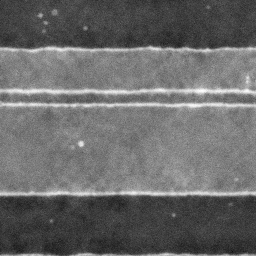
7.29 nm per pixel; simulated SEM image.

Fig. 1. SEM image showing lines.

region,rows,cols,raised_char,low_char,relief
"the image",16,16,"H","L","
LLLLLLLLLLLLLLLL
LLLLLLLLLLLLLLLL
LLLLLLLLLLLLLLLL
HHHHHHHHHHHHHHHH
HHHHHHHHHHHHHHHH
HHHHHHHHHHHHHHHH
HHHHHHHHHHHHHHHH
HHHHHHHHHHHHHHHH
HHHHHHHHHHHHHHHH
HHHHHHHHHHHHHHHH
HHHHHHHHHHHHHHHH
HHHHHHHHHHHHHHHH
LLLLLLLLLLLLLLLL
LLLLLLLLLLLLLLLL
LLLLLLLLLLLLLLLL
LLLLLLLLLLLLLLLL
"